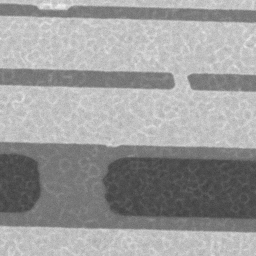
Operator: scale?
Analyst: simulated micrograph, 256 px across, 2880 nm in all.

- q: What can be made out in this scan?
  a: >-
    one or a few lines or trenches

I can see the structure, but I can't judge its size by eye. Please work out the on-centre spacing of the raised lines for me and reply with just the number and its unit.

796 nanometres